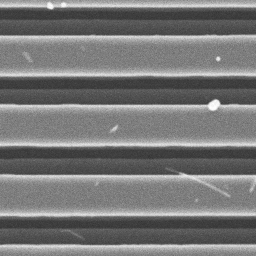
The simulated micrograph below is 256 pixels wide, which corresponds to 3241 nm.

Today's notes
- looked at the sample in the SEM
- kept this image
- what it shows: lines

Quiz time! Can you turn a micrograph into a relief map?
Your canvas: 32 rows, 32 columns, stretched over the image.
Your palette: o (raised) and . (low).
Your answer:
oooooooooooooooooooooooooooooooo
................................
................................
................................
.............................ooo
oooooooooooooooooooooooooooooooo
oooooooooooooooooooooooooooooooo
oooooooooooooooooooooooooooooooo
oooooooooooooooooooooooooooooooo
oooooooooooooooooo.ooooo.ooo..oo
................................
................................
................................
oooooooooooooooooooooooooooooooo
oooooooooooooooooooooooooooooooo
oooooooooooooooooooooooooooooooo
oooooooooooooooooooooooooooooooo
oooooooooooooooooooooooooooooooo
................................
................................
................................
................................
oooooooooooooooooooooooooooooooo
oooooooooooooooooooooooooooooooo
oooooooooooooooooooooooooooooooo
oooooooooooooooooooooooooooooooo
oooooooooooooooooooooooooooooooo
................................
................................
................................
................................
oooooooooooooooooooooooooooooooo